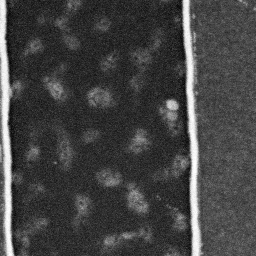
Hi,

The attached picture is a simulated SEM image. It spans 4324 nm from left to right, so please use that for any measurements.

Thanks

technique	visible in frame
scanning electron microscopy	one or a few lines or trenches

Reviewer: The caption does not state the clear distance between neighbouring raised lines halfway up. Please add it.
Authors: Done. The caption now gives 3140 nanometers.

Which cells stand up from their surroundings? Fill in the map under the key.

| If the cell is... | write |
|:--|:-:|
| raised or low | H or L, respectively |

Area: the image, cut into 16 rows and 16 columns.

LLLLLLLLLLLLHHHH
LLLLLLLLLLLLHHHH
LLLLLLLLLLLLHHHH
LLLLLLLLLLLLHHHH
LLLLLLLLLLLLHHHH
LLLLLLLLLLLLHHHH
LLLLLLLLLLLLHHHH
LLLLLLLLLLLLHHHH
LLLLLLLLLLLLHHHH
LLLLLLLLLLLLHHHH
LLLLLLLLLLLLHHHH
LLLLLLLLLLLLHHHH
LLLLLLLLLLLLHHHH
LLLLLLLLLLLLHHHH
HLLLLLLLLLLLHHHH
HLLLLLLLLLLLHHHH